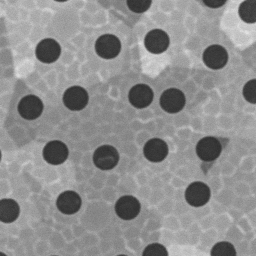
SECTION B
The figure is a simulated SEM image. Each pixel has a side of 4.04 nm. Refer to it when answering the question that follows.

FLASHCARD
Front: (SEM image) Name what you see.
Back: a regular array of holes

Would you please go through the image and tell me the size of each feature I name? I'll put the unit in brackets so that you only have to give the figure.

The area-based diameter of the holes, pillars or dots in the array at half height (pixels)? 26.4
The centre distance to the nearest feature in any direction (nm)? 199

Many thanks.